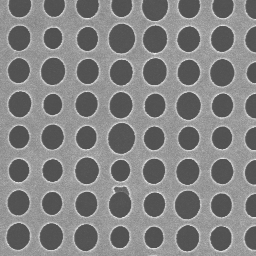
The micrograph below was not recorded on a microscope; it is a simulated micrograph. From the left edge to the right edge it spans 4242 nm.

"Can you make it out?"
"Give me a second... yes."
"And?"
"a regular array of holes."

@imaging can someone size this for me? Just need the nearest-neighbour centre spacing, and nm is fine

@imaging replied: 543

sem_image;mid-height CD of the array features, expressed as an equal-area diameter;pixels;23.9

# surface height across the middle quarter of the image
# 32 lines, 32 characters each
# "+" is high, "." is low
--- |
+++.....++++.....+++......+++...
+++......+++.....+++......++....
+++......++......+++......++....
++++....++++.....+++.....+++....
++++...+++++....+++++....++++...
++++++++++++++++++++++++++++++++
++++++++++++++++++++++++++++++++
++++...++++++...++++++..++++++..
+++.....++++.....++++....++++...
+++......++......+++.....+++....
+++......++......+++......++....
+++.....+++......+++.....+++....
++++...+++++....+++++....++++...
+++++++++++++..+++++++++++++++..
++++++++++++++++++++++++++++++++
+++++.+++++++...++++++++++++++++
++++....+++......++++....+++++..
+++.....+++.......++.....++++...
+++.....+++.......++.....+++....
+++.....+++.......++.....++++...
++++...++++......+++.....++++...
++++++++++++....++++++.+++++++..
++++++++++++++.+++++++++++++++++
+++++..+++++++++++++++++++++++++
+++.....+++++...+++++....++++...
+++......+++....++++.....+++....
+++......+++.....+++.....+++....
+++......+++....++++.....+++....
+++.....++++....++++.....+++....
++++...++++++++++++++...+++++...
++++++++++++++++++++++++++++++++
++++++++++++++++++++++++++++++++